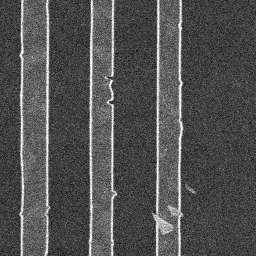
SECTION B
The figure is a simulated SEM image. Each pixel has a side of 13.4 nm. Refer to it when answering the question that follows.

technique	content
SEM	one or a few lines or trenches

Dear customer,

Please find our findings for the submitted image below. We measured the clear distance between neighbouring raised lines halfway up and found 0.591 um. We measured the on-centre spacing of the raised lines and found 896 nanometres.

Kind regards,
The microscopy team